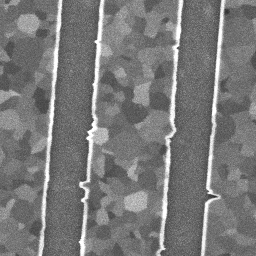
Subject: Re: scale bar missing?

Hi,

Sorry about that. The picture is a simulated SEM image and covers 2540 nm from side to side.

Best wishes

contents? one or a few lines or trenches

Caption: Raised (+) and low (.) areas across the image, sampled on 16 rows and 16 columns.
++++..+++++...++
++++..+++++...++
++++..+++++...++
++++..+++++...++
+++...+++++...++
+++...+++++..+++
+++...+++++..+++
+++...+++++..+++
+++...+++++..+++
+++...+++++..+++
+++...++++...+++
+++..+++++...+++
+++..+++++...+++
+++..+++++...+++
+++..+++++...+++
+++..+++++...+++